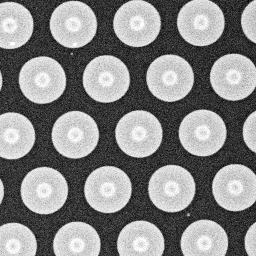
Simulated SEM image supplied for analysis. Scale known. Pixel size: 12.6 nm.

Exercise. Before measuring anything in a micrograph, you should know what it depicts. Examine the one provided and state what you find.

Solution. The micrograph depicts an array of small figures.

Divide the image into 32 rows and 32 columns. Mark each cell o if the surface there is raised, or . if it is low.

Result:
oo......ooo.....ooo....oooo....o
oooo...ooooo...ooooo..oooooo..oo
oooo..oooooo..oooooo..oooooo..oo
oooo..oooooo..oooooo..oooooo..oo
oooo...ooooo...ooooo...oooo....o
ooo.....ooo.....ooo.....oo......
................................
....ooo.....ooo....oooo....oooo.
...ooooo...ooooo...ooooo...ooooo
..oooooo..oooooo..oooooo..oooooo
..oooooo..oooooo..oooooo..oooooo
...ooooo...ooooo...ooooo...oooo.
....ooo.....ooo.....oo.......o..
................................
ooo.....ooo.....ooo....oooo....o
oooo...ooooo...ooooo...ooooo...o
oooo...ooooo...ooooo..oooooo..oo
oooo...ooooo...ooooo...ooooo...o
oooo...ooooo...ooooo...ooooo...o
ooo.....ooo.....oo..............
................................
....ooo.....ooo....oooo....ooooo
...ooooo...ooooo...ooooo...ooooo
...ooooo...ooooo...ooooo...ooooo
...ooooo...ooooo...ooooo...ooooo
...ooooo...ooooo...ooooo...ooooo
....ooo......o..................
................................
ooo.....oooo....oooo...ooooo...o
oooo...ooooo...ooooo...ooooo...o
ooooo..oooooo..ooooo...ooooo...o
oooo...ooooo...ooooo...ooooo...o